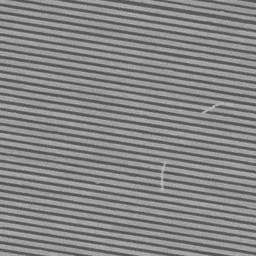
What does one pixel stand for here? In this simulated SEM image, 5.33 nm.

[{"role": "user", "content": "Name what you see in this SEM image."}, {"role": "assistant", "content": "parallel lines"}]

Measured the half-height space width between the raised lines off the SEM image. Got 14.4 nanometres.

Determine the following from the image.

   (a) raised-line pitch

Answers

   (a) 7.34 px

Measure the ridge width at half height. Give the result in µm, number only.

0.023